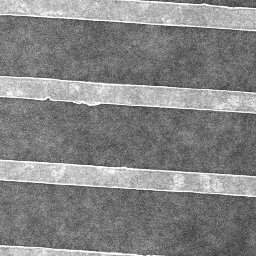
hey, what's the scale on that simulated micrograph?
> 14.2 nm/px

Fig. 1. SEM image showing one or a few lines or trenches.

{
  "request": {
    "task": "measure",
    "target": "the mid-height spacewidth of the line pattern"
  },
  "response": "895 nanometres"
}